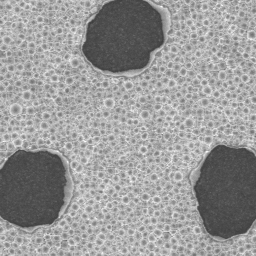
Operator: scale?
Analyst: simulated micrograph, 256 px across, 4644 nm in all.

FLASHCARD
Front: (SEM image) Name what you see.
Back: holes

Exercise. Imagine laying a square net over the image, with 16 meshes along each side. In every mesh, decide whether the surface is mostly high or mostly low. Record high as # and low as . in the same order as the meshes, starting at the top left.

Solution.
######....######
######....######
#####.....######
#####.....######
#######.########
################
################
################
################
#..##########...
....########....
....########....
....########....
....#########...
#############..#
################